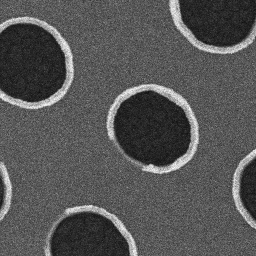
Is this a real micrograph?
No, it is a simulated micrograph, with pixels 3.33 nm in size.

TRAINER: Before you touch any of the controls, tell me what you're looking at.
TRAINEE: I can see holes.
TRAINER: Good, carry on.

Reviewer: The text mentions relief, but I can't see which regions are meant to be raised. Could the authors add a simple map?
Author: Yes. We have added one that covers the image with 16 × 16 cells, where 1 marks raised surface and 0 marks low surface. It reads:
1111111111100000
1011111111110000
0001111111110001
0000111111111111
0000111111111111
0000111111111111
1111111100011111
1111111000001111
1111111000001111
1111111100001111
1111111111111110
1111111111111110
1111111111111110
1111001111111111
1110000011111111
1110000011111111